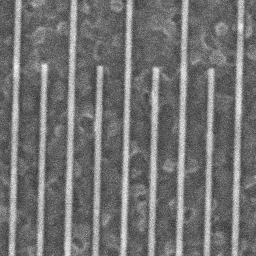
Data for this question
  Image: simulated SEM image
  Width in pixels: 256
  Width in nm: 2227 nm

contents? parallel lines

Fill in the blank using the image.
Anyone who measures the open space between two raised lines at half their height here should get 198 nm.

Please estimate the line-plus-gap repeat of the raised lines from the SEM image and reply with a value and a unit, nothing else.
0.242 um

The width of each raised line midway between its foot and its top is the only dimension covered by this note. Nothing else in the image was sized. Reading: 4.75 pixels